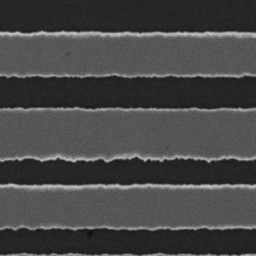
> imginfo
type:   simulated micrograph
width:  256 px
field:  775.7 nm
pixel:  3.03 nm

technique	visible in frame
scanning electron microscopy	lines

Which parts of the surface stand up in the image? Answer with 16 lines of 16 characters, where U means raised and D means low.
DDDDDDDDDDDDDDDD
DDDDDDDDDDDDDDDD
UUUUUUUUUUUUUUUU
UUUUUUUUUUUUUUUU
UUUUUUUUUUUUUUUU
DDDDDDDDDDDDDDDD
DDDDDDDDDDDDDDDD
UUUUUUUUUUUUUUUU
UUUUUUUUUUUUUUUU
UUUUUUUUUUUUUUUU
DDDDDDDDDDDDDDDD
DDDDDDDDDDDDDDDD
UUUUUUUUUUUUUUUU
UUUUUUUUUUUUUUUU
DDDDDDDDDDDDDDDD
DDDDDDDDDDDDDDDD